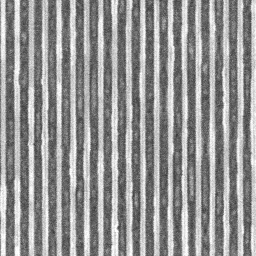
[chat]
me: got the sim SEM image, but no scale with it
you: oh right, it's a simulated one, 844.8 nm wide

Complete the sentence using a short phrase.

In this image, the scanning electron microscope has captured parallel lines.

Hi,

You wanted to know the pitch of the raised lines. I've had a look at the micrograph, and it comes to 0.0462 µm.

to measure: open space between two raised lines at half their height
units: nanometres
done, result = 28.9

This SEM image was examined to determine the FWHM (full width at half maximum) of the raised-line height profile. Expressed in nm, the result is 14.9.